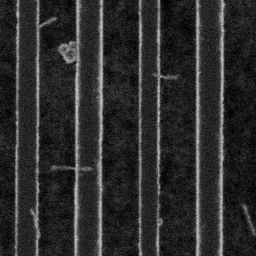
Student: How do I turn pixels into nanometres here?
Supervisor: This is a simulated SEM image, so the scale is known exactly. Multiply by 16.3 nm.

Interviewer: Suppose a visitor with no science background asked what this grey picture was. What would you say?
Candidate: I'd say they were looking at lines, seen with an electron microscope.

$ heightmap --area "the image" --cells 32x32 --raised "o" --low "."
..ooo.....ooo.....oo.....ooo....
..ooo.....ooo.....oo.....ooo....
..ooo.....ooo.....oo.....ooo....
..ooo.....ooo.....oo.....ooo....
..ooo.....ooo.....oo.....ooo....
..ooo.....ooo.....oo.....ooo....
..ooo...ooooo.....oo.....ooo....
..ooo....oooo.....oo.....ooo....
..ooo.....ooo.....oo.....ooo....
..ooo.....ooo.....oo.....ooo....
..ooo.....ooo.....oo.....ooo....
..ooo.....ooo.....oo.....ooo....
..ooo.....ooo.....oo.....ooo....
..ooo.....ooo.....oo.....ooo....
..ooo.....ooo.....oo.....ooo....
..ooo.....ooo.....oo.....ooo....
..ooo.....ooo.....oo.....ooo....
..ooo.....ooo.....oo.....ooo....
..ooo.....ooo.....oo.....ooo....
..ooo.....ooo.....oo.....ooo....
..ooo.....ooo.....oo.....ooo....
..ooo....oooo.....oo.....ooo....
..ooo.....ooo.....oo.....ooo....
..ooo.....ooo.....oo.....ooo....
..ooo.....ooo.....oo.....ooo....
..ooo.....ooo.....oo.....ooo....
..ooo....oooo.....oo.....ooo....
..ooo....oooo.....oo.....ooo....
..ooo....oooo.....oo.....ooo....
..ooo....oooo.....oo.....ooo....
..ooo....oooo.....oo.....ooo....
..ooo....oooo.....oo.....ooo....